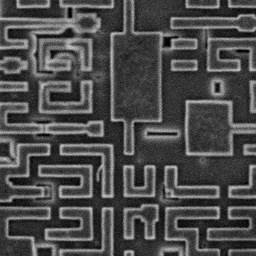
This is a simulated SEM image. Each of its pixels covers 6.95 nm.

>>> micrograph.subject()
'wiring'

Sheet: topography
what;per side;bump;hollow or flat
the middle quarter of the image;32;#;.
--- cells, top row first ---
#....##.....############...#####
............############........
............############........
............############........
............############........
#....##.....############........
#....##.....############........
.....##.....############........
.....#......############........
....###.....############.......#
#######.....############.......#
#######.....############.......#
............############.......#
............############.......#
...............##..............#
#####.###......##..............#
#########......##..............#
......###......##..............#
...............##..............#
...............##..............#
####...###.....##..............#
############...##..............#
.........###....................
..........##....................
..........##....................
######...###....................
#######...##...##....#...###....
#######...##...##....#...###....
....###...##...##....#...###....
....###...##...##....#...###....
....###...##...##...##...###....
#######...##...#######...#######